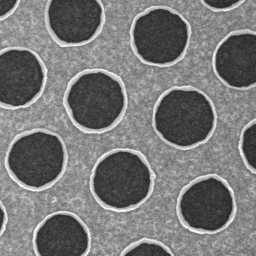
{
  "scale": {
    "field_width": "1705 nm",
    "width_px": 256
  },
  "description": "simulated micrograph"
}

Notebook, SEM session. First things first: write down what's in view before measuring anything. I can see holes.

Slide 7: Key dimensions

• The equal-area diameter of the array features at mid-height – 388 nanometres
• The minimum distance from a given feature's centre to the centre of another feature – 560 nanometres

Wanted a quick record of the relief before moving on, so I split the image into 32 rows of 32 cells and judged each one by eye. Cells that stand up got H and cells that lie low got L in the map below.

LLHHHHLLLLLLLHHHHHHHHHHHHHLLLLHH
LHHHHHLLLLLLLHHHHHLLLLHHHHHHHHHH
HHHHHHLLLLLLLHHHHLLLLLLHHHHHHHHH
HHHHHHLLLLLLHHHHHLLLLLLLHHHHHHHH
HHHHHHHLLLLLHHHHHLLLLLLLHHHHHLLL
HHHHHHHHLHHHHHHHHLLLLLLHHHHHLLLL
LLLLHHHHHHHHHHHHHLLLLLLHHHHLLLLL
LLLLLHHHHHHHHHHHHHLLLLHHHHHLLLLL
LLLLLHHHHHHHHHHHHHHHHHHHHHHLLLLL
LLLLLLHHHHLLLLHHHHHHHHHHHHHLLLLL
LLLLLHHHHLLLLLLHHHHHHHHHHHHHLLLL
LLLLLHHHLLLLLLLHHHHHHLLLLHHHHHHH
LLLLHHHHLLLLLLLLHHHHLLLLLLHHHHHH
HHHHHHHHLLLLLLLLHHHHLLLLLLLHHHHH
HHHHHHHHHLLLLLLHHHHLLLLLLLLHHHHH
HHHHHHHHHHLLLLHHHHHLLLLLLLLHHHHL
HHHHLLHHHHHHHHHHHHHHLLLLLLHHHHLL
HHLLLLLLHHHHHHHHHHHHHLLLLLHHHHLL
HLLLLLLLHHHHHHHHHHHHHHHHHHHHHHLL
HLLLLLLLHHHHHLLLLHHHHHHHHHHHHHLL
HLLLLLLLHHHHLLLLLLHHHHHHHHHHHHHL
HLLLLLLLHHHHLLLLLLLHHHHHHHHHHHHH
HHLLLLLHHHHHLLLLLLLHHHHHHLLLHHHH
HHHHLHHHHHHHLLLLLLLHHHHLLLLLLHHH
HHHHHHHHHHHHLLLLLLHHHHHLLLLLLHHH
HHHHHHHHHHHHHLLLLHHHHHLLLLLLLHHH
LHHHHHHHHHHHHHHHHHHHHHLLLLLLLHHH
LHHHHHLLLLHHHHHHHHHHHHHLLLLLLHHH
HHHHHLLLLLLHHHHHHHHHHHHHLLLLHHHH
HHHHLLLLLLLHHHHHHHHHHHHHHHHHHHHH
HHHHLLLLLLLHHHHHHLLLHHHHHHHHHHHH
HHHHHLLLLLLHHHHHLLLLLHHHHHHHHHHH